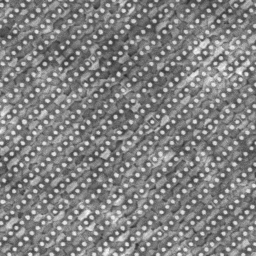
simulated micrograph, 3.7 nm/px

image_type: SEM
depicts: a regular array of raised bodies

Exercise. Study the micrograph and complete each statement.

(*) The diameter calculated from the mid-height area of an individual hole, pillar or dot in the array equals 3.89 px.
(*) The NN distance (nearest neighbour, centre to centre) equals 28.2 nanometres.